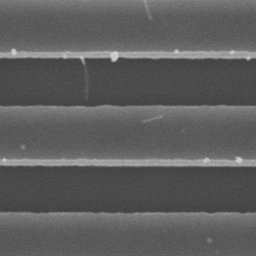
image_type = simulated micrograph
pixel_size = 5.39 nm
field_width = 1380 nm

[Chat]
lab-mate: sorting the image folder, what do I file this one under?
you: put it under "lines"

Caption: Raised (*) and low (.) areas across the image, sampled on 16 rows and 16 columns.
****************
****************
****************
****************
................
................
................
****************
****************
****************
................
................
................
****************
****************
****************